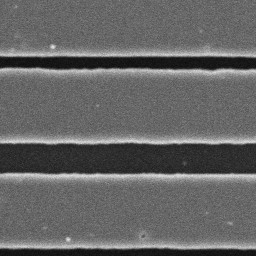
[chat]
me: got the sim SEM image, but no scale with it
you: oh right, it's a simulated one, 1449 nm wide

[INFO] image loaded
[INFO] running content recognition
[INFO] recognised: lines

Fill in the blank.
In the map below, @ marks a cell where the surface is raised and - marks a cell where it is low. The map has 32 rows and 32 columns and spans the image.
@@@@@@@@@@@@@@@@@@@@@@@@@@@@@@@@
@@@@@@@@@@@@@@@@@@@@@@@@@@@@@@@@
@@@@@@@@@@@@@@@@@@@@@@@@@@@@@@@@
@@@@@@@@@@@@@@@@@@@@@@@@@@@@@@@@
@@@@@@@@@@@@@@@@@@@@@@@@@@@@@@@@
@@@@@@@@@@@@@@@@@@@@@@@@@@@@@@@@
@@@@@@@@@@@@@@@@@@@@@@@@@@@@@@@@
--------------------------------
@@@-@---------------------------
@@@@@@@@@@@@@@@@@@@@@@@@@@@@@@@@
@@@@@@@@@@@@@@@@@@@@@@@@@@@@@@@@
@@@@@@@@@@@@@@@@@@@@@@@@@@@@@@@@
@@@@@@@@@@@@@@@@@@@@@@@@@@@@@@@@
@@@@@@@@@@@@@@@@@@@@@@@@@@@@@@@@
@@@@@@@@@@@@@@@@@@@@@@@@@@@@@@@@
@@@@@@@@@@@@@@@@@@@@@@@@@@@@@@@@
@@@@@@@@@@@@@@@@@@@@@@@@@@@@@@@@
@@@@@@@@@@@@@@@@@@@@@@@@@@@@@@@@
--------------------------------
--------------------------------
--------------------------------
--------------------------------
@@@@@@@@@@@@@@@@@@@@@@@@@@@@@@@@
@@@@@@@@@@@@@@@@@@@@@@@@@@@@@@@@
@@@@@@@@@@@@@@@@@@@@@@@@@@@@@@@@
@@@@@@@@@@@@@@@@@@@@@@@@@@@@@@@@
@@@@@@@@@@@@@@@@@@@@@@@@@@@@@@@@
@@@@@@@@@@@@@@@@@@@@@@@@@@@@@@@@
@@@@@@@@@@@@@@@@@@@@@@@@@@@@@@@@
@@@@@@@@@@@@@@@@@@@@@@@@@@@@@@@@
@@@@@@@@@@@@@@@@@@@@@@@@@@@@@@@@
--------------------------------